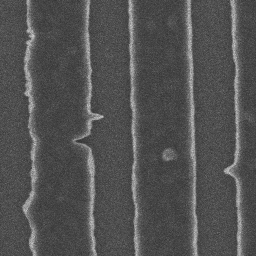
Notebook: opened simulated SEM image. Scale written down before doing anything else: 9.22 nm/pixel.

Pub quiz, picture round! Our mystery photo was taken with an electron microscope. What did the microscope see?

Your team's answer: one or a few lines or trenches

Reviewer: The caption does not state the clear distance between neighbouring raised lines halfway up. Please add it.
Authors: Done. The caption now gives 397 nm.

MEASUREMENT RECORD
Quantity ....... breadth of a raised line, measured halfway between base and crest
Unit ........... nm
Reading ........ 552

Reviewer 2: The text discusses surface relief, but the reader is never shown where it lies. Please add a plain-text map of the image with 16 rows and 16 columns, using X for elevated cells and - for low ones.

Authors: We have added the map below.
--XXXX--XXXX---X
--XXX---XXXX---X
--XXX---XXXX---X
--XXXX--XXXX---X
--XXXX--XXXX---X
--XXXX--XXXX---X
--XXXX--XXXX---X
--XXXX--XXXX---X
--XXX---XXXX---X
--XXXX--XXXX---X
--XXXX--XXXX--XX
--XXXX--XXXX---X
--XXXX--XXXX---X
--XXXX--XXXX---X
--XXXX--XXXX---X
--XXXX---XXX---X